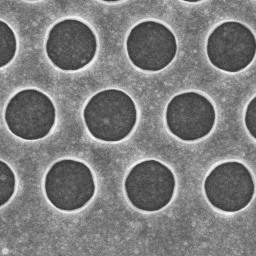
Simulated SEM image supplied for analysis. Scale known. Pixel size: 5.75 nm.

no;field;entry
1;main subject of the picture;a regular array of holes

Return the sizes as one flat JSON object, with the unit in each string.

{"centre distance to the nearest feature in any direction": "460 nanometres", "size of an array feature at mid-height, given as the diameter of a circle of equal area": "51.4 pixels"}